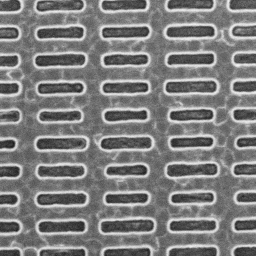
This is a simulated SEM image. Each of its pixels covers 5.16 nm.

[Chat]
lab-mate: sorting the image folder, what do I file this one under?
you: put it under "a regular array of holes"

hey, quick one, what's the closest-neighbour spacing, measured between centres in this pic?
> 0.142 µm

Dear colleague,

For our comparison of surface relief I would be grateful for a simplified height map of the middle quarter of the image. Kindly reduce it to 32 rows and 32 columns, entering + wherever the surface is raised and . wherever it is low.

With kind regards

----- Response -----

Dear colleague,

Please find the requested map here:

....+++++++....++.++++++++..++++
++++++++++++++++++++++++++++++++
++++++++++++++++++++++++++++++++
++++++++++++++++++++++++++++++++
+++.++++++..........++++++......
.....++++............++++.......
.....++++............++++.......
....++++++++++++.+++++++++......
++++++++++++++++++++++++++++++++
++++++++++++++++++++++++++++++++
++++++++++++++++++++++++++++++++
+++++++++++......++..+++++++....
....++++++...........+++++......
....++++++...........+++++......
+++++++++++....++++++++++++++..+
++++++++++++++++++++++++++++++++
++++++++++++++++++++++++++++++++
++++++++++++++++++++++++++++++++
.....+++++............+++++.....
......+++.............++++......
......+++.............+++++.....
.+++++++++....++...+++++++++++++
++++++++++++++++++++++++++++++++
++++++++++++++++++++++++++++++++
++++++++++++++++++++++++++++++++
.....++++++.........++++++......
.....++++++..........++++.......
.....++++++..........+++++......
...+++++++++++++++++++++++++++++
++++++++++++++++++++++++++++++++
++++++++++++++++++++++++++++++++
++++++++++++++++++++++++++++++++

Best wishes